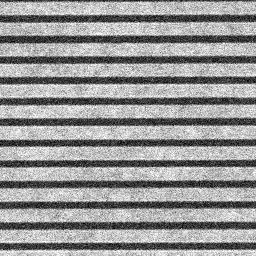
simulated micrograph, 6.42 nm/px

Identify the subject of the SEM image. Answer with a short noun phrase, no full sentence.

parallel lines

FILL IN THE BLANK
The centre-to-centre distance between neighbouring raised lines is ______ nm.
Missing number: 133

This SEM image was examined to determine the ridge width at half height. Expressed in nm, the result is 78.7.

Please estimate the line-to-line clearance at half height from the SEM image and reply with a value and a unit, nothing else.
53.8 nm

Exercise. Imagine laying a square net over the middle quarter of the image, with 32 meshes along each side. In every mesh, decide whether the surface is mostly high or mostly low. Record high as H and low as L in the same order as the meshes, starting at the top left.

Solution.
HHHHHHHHHHHHHHHHHHHHHHHHHHHHHHHH
HHHHHHHHHHHHHHHHHHHHHHHHHHHHHHHH
HHHHHHHHHHHHHHHHHHHHHHHHHHHHHHHH
LLLLLLLLLLLLLLLLLLLLLLLLLLLLLLLL
LLLLLLLLLLLLLLLLLLLLLLLLLLLLLLLL
HHHHHHHHHHHHHHHHHHHHHHHHHHHHHHHH
HHHHHHHHHHHHHHHHHHHHHHHHHHHHHHHH
HHHHHHHHHHHHHHHHHHHHHHHHHHHHHHHH
LLLLLLLLLLLLLLLLLLLLLLLLLLLLLLLL
LLLLLLLLLLLLLLLLLLLLLLLLLLLLLLLL
LLLLHHHHHHHHHHHHHHHHHHHHHHHHHHHH
HHHHHHHHHHHHHHHHHHHHHHHHHHHHHHHH
HHHHHHHHHHHHHHHHHHHHHHHHHHHHHHHH
LLLLLLLLLLLLLLLLLLLLLLLLLLLLLLLL
LLLLLLLLLLLLLLLLLLLLLLLLLLLLLLLL
LLLLLLLLLLLLLLLLLLLLLLLLLLLLLLLL
HHHHHHHHHHHHHHHHHHHHHHHHHHHHHHHH
HHHHHHHHHHHHHHHHHHHHHHHHHHHHHHHH
HHHHHHHHHHHHHHHHHHHHHHHHHHHHHHHH
LLLLLLLLLLLLLLLLLLLLLLLLLLLLLLLL
LLLLLLLLLLLLLLLLLLLLLLLLLLLLLLLL
HHHHHHHHHHHHHHHHHHHHHHHHHHHHHHHH
HHHHHHHHHHHHHHHHHHHHHHHHHHHHHHHH
HHHHHHHHHHHHHHHHHHHHHHHHHHHHHHHH
LLLLLLLLLLLLLLLLLLLLLLLLLLLLLLLL
LLLLLLLLLLLLLLLLLLLLLLLLLLLLLLLL
HHHHHHHHHHHHHHHHHHHHHHHHHHHHHHHH
HHHHHHHHHHHHHHHHHHHHHHHHHHHHHHHH
HHHHHHHHHHHHHHHHHHHHHHHHHHHHHHHH
LLLLLLLLLLLLLLLLLLLLLLLLLLLLLLLL
LLLLLLLLLLLLLLLLLLLLLLLLLLLLLLLL
HHHHHHHHHHHHHHHHHHHHHHHHHHHHHHHH